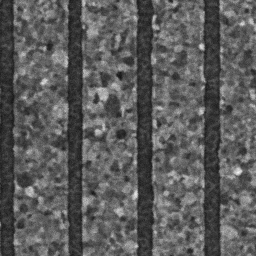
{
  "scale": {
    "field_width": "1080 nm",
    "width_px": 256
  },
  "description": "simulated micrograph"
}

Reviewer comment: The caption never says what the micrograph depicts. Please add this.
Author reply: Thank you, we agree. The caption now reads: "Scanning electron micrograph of one or a few lines or trenches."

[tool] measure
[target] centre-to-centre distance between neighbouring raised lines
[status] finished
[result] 286 nm